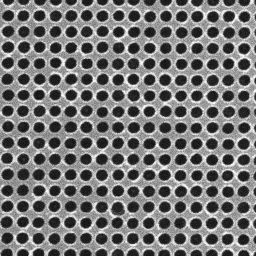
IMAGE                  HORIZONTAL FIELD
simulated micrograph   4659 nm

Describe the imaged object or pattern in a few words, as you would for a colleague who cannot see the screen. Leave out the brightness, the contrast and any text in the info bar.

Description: a regular array of holes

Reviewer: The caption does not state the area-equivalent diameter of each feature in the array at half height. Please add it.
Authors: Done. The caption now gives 215 nm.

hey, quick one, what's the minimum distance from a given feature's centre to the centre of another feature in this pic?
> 280 nanometres